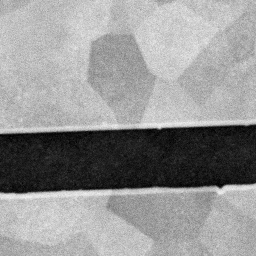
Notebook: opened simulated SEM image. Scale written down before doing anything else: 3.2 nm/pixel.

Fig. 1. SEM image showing one or a few lines or trenches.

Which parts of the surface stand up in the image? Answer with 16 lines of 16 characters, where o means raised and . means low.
oooooooooooooooo
oooooooooooooooo
oooooooooooooooo
oooooooooooooooo
oooooooooooooooo
oooooooooooooooo
oooooooooooooooo
oooooooooooooooo
................
................
................
................
oooooooooooooooo
oooooooooooooooo
oooooooooooooooo
oooooooooooooooo